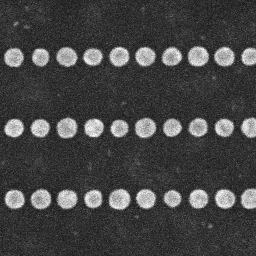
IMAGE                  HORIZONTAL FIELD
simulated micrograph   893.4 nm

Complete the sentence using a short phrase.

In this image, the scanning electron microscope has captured a regular array of raised bodies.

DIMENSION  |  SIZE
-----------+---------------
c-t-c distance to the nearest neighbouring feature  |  90.7 nanometers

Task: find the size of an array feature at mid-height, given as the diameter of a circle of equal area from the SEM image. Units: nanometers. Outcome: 64.9